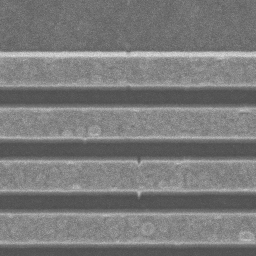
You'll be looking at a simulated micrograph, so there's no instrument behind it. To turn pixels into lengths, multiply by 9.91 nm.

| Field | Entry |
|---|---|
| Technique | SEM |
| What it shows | parallel lines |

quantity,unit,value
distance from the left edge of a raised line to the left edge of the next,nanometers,520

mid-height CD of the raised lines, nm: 331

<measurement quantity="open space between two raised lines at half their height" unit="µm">0.187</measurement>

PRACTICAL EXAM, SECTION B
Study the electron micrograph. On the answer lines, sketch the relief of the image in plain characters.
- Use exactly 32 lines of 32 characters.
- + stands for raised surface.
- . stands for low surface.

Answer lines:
................................
................................
................................
................................
................................
................................
................................
++++++++++++++++++++++++++++++++
++++++++++++++++++++++++++++++++
++++++++++++++++++++++++++++++++
++++++++++++++++++++++++++++++++
................................
................................
++++++++++++++++++++++++++++++++
++++++++++++++++++++++++++++++++
++++++++++++++++++++++++++++++++
++++++++++++++++++++++++++++++++
..........+.....................
................................
................................
++++++++++++++++++++++++++++++++
++++++++++++++++++++++++++++++++
++++++++++++++++++++++++++++++++
++++++++++++++++++++++++++++++++
................................
................................
................................
++++++++++++++++++++++++++++++++
++++++++++++++++++++++++++++++++
++++++++++++++++++++++++++++++++
++++++++++++++++++++++++++++++++
................................